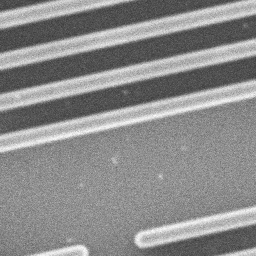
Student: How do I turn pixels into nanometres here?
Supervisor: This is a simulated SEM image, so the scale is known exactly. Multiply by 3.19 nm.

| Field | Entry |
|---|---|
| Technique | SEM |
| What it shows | groups of lines, slits or small figures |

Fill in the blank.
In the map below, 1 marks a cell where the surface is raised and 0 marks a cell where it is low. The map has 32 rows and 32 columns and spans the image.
00000111111111000000000000000111
01111111110000000000000011111111
11111000000000000001111111110000
10000000000000011111111100000000
00000000001111111110000000000000
00000011111111100000000000000111
01111111110000000000000001111111
11111000000000000000111111111000
10000000000000001111111110000000
00000000000111111111000000000000
00000011111111100000000000000011
00111111111000000000000001111111
11111100000000000000111111111000
11000000000000001111111110000000
00000000000111111111000000000000
00000001111111110000000000000000
00111111111000000000000000000000
11111110000000000000000000000000
11000000000000000000000000000000
00000000000000000000000000000000
00000000000000000000000000000000
00000000000000000000000000000000
00000000000000000000000000000000
00000000000000000000000000000000
00000000000000000000000000000000
00000000000000000000000000000000
00000000000000000000000000000111
00000000000000000000000001111111
00000000000000000000111111111000
00000000000000000111111100000000
00000000000000000111000000000000
00000011111000000000000000000011